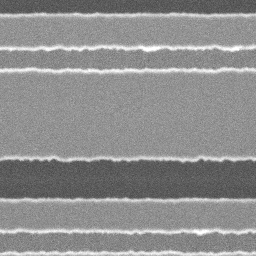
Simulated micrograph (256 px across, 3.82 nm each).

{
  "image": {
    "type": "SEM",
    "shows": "lines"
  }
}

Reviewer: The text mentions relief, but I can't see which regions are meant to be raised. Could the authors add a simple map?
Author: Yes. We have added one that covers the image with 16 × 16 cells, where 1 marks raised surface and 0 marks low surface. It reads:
0000000000000000
1111111111111111
1111111111111111
1111111111111111
1111111111111111
1111111111111111
1111111111111111
1111111111111111
1111111111111111
1111111111111111
0000000000000000
0000000000000000
1111111111111111
1111111111111111
1111111111111111
1111111111111111